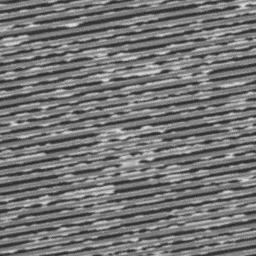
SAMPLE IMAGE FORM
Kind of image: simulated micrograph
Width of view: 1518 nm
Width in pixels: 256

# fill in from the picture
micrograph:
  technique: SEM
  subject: parallel lines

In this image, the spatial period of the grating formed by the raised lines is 50.7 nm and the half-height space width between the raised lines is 21.2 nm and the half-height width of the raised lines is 32.9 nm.